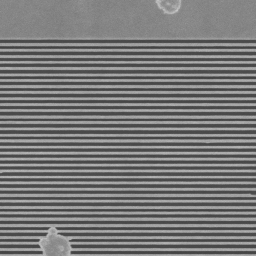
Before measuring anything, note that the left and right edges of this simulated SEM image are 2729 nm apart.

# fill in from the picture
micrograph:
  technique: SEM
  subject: parallel lines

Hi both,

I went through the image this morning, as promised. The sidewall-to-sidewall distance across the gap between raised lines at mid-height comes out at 29.3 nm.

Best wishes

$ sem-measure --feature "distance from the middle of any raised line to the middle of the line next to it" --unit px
6.03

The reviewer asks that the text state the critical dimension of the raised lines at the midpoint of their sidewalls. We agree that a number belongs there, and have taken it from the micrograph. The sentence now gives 0.0293 micrometres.